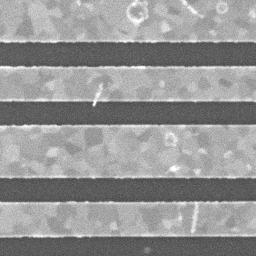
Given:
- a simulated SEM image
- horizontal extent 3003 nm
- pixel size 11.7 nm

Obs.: lines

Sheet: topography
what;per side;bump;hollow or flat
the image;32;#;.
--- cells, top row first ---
################################
################################
################################
################################
################################
................................
................................
................................
################################
################################
################################
################################
################################
................................
................................
................................
################################
################################
################################
################################
################################
################################
................................
................................
................................
################################
################################
################################
################################
########.##.....................
................................
................................